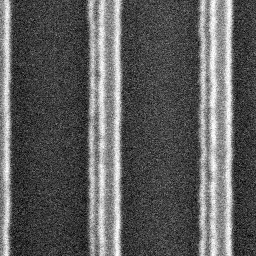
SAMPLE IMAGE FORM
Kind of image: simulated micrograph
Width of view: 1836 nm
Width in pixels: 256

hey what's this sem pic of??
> lines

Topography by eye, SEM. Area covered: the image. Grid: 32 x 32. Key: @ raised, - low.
@----------@@@@----------@@@@---
@----------@@@@----------@@@@---
@----------@@@@----------@@@@---
@----------@@@@----------@@@@---
@----------@@@@----------@@@@---
@----------@@@@----------@@@@---
@----------@@@@----------@@@@---
@-----------@@@----------@@@@---
@----------@@@@----------@@@@---
@----------@@@@----------@@@@---
@----------@@@@----------@@@@---
@----------@@@@----------@@@@---
@-----------@@@----------@@@@---
@----------@@@@----------@@@@---
@----------@@@@----------@@@@---
@----------@@@@----------@@@@---
@----------@@@@----------@@@@---
@----------@@@@----------@@@@---
@----------@@@@----------@@@@---
@----------@@@@----------@@@@---
@----------@@@@----------@@@@---
@----------@@@@----------@@@@---
@----------@@@@----------@@@@---
@----------@@@@----------@@@@---
@----------@@@@----------@@@@---
@----------@@@@----------@@@@---
@----------@@@@----------@@@@---
@----------@@@@----------@@@@---
@----------@@@@----------@@@@---
@----------@@@@----------@@@@---
@----------@@@@----------@@@@---
@----------@@@@----------@@@@---